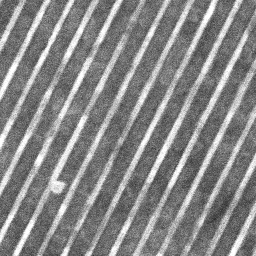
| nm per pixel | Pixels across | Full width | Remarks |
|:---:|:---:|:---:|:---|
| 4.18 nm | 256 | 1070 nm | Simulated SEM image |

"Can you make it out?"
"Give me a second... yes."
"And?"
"parallel lines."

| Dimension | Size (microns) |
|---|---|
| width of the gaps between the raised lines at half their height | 0.0723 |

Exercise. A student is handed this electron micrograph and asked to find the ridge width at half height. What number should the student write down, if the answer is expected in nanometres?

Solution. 18.2